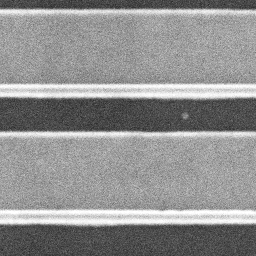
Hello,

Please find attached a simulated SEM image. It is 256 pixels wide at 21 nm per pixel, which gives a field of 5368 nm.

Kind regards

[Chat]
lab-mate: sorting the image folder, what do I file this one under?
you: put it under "lines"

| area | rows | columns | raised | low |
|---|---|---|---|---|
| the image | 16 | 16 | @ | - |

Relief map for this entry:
----------------
@@@@@@@@@@@@@@@@
@@@@@@@@@@@@@@@@
@@@@@@@@@@@@@@@@
@@@@@@@@@@@@@@@@
@@@@@@@@@@@@@@@@
----------------
----------------
@@@@@@@@@@@@@@@@
@@@@@@@@@@@@@@@@
@@@@@@@@@@@@@@@@
@@@@@@@@@@@@@@@@
@@@@@@@@@@@@@@@@
@@@@@@@@@@@@@@@@
----------------
----------------